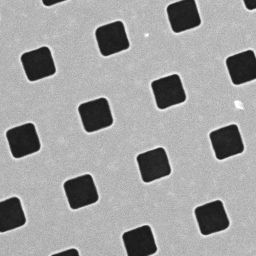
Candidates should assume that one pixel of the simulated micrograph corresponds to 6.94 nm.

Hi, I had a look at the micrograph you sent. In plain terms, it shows a regular array of holes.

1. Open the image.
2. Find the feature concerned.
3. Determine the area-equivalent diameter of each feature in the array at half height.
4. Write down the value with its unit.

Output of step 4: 228 nm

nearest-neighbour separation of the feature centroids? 532 nm